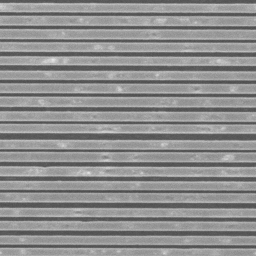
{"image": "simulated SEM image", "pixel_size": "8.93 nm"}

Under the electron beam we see parallel lines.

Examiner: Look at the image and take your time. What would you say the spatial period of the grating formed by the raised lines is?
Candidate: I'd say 122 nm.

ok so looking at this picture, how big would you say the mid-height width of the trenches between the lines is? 34.6 nanometres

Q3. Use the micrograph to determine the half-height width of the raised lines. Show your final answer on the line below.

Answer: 78.2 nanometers